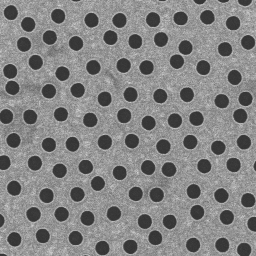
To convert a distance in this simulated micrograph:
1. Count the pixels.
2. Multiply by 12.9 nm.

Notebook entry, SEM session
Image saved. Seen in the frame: a regular array of holes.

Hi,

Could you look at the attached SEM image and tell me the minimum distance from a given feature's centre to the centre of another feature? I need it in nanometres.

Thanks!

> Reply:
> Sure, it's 298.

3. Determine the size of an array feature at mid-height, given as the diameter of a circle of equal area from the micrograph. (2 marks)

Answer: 182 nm